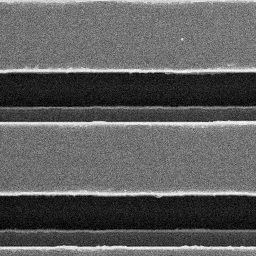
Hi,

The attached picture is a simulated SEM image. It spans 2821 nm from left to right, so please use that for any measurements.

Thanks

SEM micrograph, lines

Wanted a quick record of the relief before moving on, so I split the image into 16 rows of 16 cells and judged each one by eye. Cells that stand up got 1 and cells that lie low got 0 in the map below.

1111111111111111
1111111111111111
1111111111111111
1111111111111111
1000100011111000
0000000000000000
0000000000000000
1111111111111111
1111111111111111
1111111111111111
1111111111111111
1111111111111111
0000000000000000
0000000000000000
1111111111111111
1111111111111111